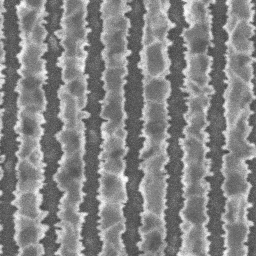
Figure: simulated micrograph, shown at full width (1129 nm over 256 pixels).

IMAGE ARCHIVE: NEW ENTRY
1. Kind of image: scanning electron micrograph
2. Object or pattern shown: parallel lines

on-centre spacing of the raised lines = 0.183 micrometres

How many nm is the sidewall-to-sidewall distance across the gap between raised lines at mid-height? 74.9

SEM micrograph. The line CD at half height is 102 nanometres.